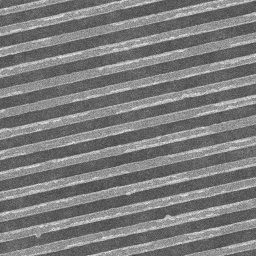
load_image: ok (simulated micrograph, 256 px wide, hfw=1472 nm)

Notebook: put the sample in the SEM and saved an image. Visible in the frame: parallel lines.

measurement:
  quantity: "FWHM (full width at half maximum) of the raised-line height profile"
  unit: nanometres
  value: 49.9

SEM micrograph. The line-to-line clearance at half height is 11.4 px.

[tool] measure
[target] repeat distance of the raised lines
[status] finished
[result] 20.1 pixels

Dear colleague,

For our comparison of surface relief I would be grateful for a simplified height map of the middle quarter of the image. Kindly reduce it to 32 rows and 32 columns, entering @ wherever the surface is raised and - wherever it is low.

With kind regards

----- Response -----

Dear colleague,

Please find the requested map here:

----------@@@@@@@@@@------------
------@@@@@@@@@@--------------@@
-@@@@@@@@@@---------------@@@@@@
@@@@@@@--------------@@@@@@@@@--
@@--------------@@@@@@@@@-------
-----------@@@@@@@@@@-----------
-------@@@@@@@@@---------------@
---@@@@@@@@@--------------@@@@@@
@@@@@@@---------------@@@@@@@@--
@@---------------@@@@@@@@@------
------------@@@@@@@@@@----------
--------@@@@@@@@@@-------------@
---@@@@@@@@@@--------------@@@@@
@@@@@@@@@-------------@@@@@@@@@@
@@@@-------------@@@@@@@@@@-----
-------------@@@@@@@@@@---------
--------@@@@@@@@@---------------
----@@@@@@@@@@-------------@@@@@
@@@@@@@@@--------------@@@@@@@@@
@@@@--------------@@@@@@@@@@----
-------------@@@@@@@@@@---------
---------@@@@@@@@@@-------------
----@@@@@@@@@@--------------@@@@
@@@@@@@@@@-------------@@@@@@@@@
@@@@@-------------@@@@@@@@@@----
--------------@@@@@@@@@@--------
---------@@@@@@@@@@-------------
-----@@@@@@@@@@-------------@@@@
@@@@@@@@@@---------------@@@@@@@
@@@@@---------------@@@@@@@@@---
@--------------@@@@@@@@@--------
-----------@@@@@@@@@------------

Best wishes